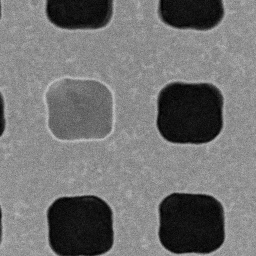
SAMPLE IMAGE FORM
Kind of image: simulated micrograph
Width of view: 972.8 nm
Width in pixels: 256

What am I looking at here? holes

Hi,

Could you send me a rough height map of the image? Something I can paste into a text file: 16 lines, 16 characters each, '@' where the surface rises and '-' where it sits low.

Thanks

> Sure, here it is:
@@@----@@@----@@
@@@----@@@----@@
@@@@@@@@@@@@@@@@
@@@@@@@@@@@@@@@@
@@@@@@@@@@@@@@@@
@@@@@@@@@@---@@@
@@@@@@@@@@----@@
@@@@@@@@@@----@@
@@@@@@@@@@----@@
@@@@@@@@@@@@@@@@
@@@@@@@@@@@@@@@@
@@@@@@@@@@@@@@@@
@@@@--@@@@----@@
@@@----@@@----@@
@@@----@@@----@@
@@@----@@@----@@